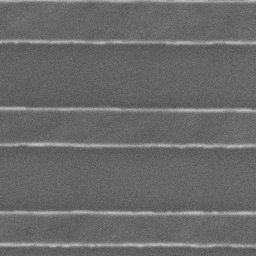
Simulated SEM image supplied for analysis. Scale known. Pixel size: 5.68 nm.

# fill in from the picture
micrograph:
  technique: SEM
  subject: lines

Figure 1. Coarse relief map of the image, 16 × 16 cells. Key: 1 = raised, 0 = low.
1111111111111111
1111111111111111
1111111111111111
0000000000000000
0000000000000000
0000000000000000
0000000000000000
1111111111111111
1111111111111111
0000000000000000
0000000000000000
0000000000000000
0000000000000000
1111111111111111
1111111111111111
0000000000000000